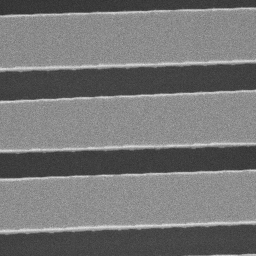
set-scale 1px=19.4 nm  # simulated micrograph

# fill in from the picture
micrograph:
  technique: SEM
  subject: lines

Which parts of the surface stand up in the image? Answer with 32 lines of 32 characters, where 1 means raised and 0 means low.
00000000000000000000000000000000
00000000000000011111111111111111
11111111111111111111111111111111
11111111111111111111111111111111
11111111111111111111111111111111
11111111111111111111111111111111
11111111111111111111111111111111
11111111111111111111111111111111
11111111110000000000000000000000
00000000000000000000000000000000
00000000000000000000000000000000
00000000000000000000000000011111
00001111111111111111111111111111
11111111111111111111111111111111
11111111111111111111111111111111
11111111111111111111111111111111
11111111111111111111111111111111
11111111111111111111111111111111
11111111111111111000000000000000
00000000000000000000000000000000
00000000000000000000000000000000
00000000000000000000000011111111
11111111111111111111111111111111
11111111111111111111111111111111
11111111111111111111111111111111
11111111111111111111111111111111
11111111111111111111111111111111
11111111111111111111111111111111
11111111111111100000000000000000
00000000000000000000000000000000
00000000000000000000000000000000
00000000000000000000000000000000